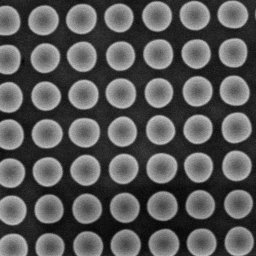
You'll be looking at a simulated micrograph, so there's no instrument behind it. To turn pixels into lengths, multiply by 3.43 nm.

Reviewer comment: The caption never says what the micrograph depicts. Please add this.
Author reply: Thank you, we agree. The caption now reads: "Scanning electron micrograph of an array of small figures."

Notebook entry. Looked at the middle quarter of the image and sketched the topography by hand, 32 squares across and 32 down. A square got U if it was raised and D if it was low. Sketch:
DDUUUUUDDDDDUUUUUDDDDUUUUUDDDDDU
DDDUUUDDDDDDDUDDDDDDDDDDDDDDDDDD
DDDDDDDDDDDDDDDDDDDDDDDDDDDDDDDD
DDDDDDDDDDDDDDDDDDDDDDDDDDDDDDDD
DDDUUUUDDDDDUUUUUDDDDUUUUUDDDDDU
DDUUUUUUDDDUUUUUUUDDDUUUUUUDDDUU
DUUUUUUUDDDUUUUUUUDDUUUUUUUDDDUU
DUUUUUUUUDDUUUUUUUDDUUUUUUUDDDUU
DUUUUUUUDDDUUUUUUUDDDUUUUUUDDDUU
DDUUUUUUDDDUUUUUUDDDDUUUUUDDDDDU
DDUUUUUDDDDDUUUUDDDDDDUUUDDDDDDD
DDDDDDDDDDDDDDDDDDDDDDDDDDDDDDDD
DDDDDDDDDDDDDDDDDDDDDDDDDDDDDDDD
DDDDDDDDDDDDDUUUDDDDDDUUUUDDDDDU
DDUUUUUUDDDDUUUUUDDDDUUUUUUDDDDU
DDUUUUUUUDDUUUUUUUDDDUUUUUUDDDUU
DUUUUUUUUDDUUUUUUUDDDUUUUUUUDDUU
DUUUUUUUUDDUUUUUUUDDDUUUUUUUDDUU
DUUUUUUUUDDUUUUUUUDDDUUUUUUDDDDU
DDUUUUUUDDDDUUUUUDDDDDUUUUDDDDDD
DDDDUUUDDDDDDUUUDDDDDDDDDDDDDDDD
DDDDDDDDDDDDDDDDDDDDDDDDDDDDDDDD
DDDDDDDDDDDDDDDDDDDDDDDUUDDDDDDD
DDDUUUUUDDDDUUUUUUDDDDUUUUUDDDDU
DDUUUUUUDDDDUUUUUUDDDUUUUUUUDDUU
DDUUUUUUUDDUUUUUUUUDDUUUUUUUDDUU
DDUUUUUUUDDUUUUUUUUDDUUUUUUUDDUU
DDUUUUUUUDDUUUUUUUDDDUUUUUUUDDDU
DDUUUUUUUDDDUUUUUUDDDDUUUUUDDDDU
DDDUUUUUDDDDDUUUDDDDDDDUUUDDDDDD
DDDDDDDDDDDDDDDDDDDDDDDDDDDDDDDD
DDDDDDDDDDDDDDDDDDDDDDDDDDDDDDDD